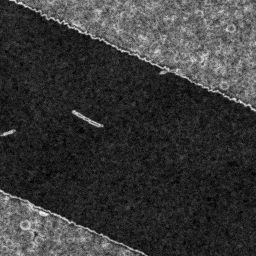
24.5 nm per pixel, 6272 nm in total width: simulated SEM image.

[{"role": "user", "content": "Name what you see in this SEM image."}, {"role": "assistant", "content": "one or a few lines or trenches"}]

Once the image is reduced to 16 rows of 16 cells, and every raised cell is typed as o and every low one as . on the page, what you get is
oo..............
oooo............
oooooo..........
ooooooooo.......
ooooooooooo.....
ooooooooooooo...
ooooooooooooooo.
oooooooooooooooo
oooooooooooooooo
oooooooooooooooo
oooooooooooooooo
oooooooooooooooo
.ooooooooooooooo
....oooooooooooo
......oooooooooo
........oooooooo